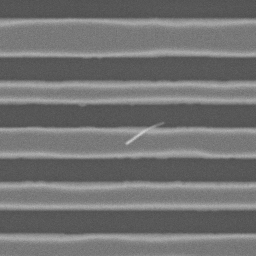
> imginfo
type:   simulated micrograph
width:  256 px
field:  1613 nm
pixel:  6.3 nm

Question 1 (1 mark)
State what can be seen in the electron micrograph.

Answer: lines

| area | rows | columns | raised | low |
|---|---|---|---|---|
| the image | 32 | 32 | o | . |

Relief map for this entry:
................................
................................
.ooooooooooooooo.oooo........ooo
oooooooooooooooooooooooooooooooo
oooooooooooooooooooooooooooooooo
oooooooooooooooooooooooooooooooo
oooooooooooooooooooooooooooooooo
................................
................................
................................
oooooooooooooooooooooooooooooooo
oooooooooooooooooooooooooooooooo
oooooooooooooooooooooooooooooooo
................................
................................
................................
oooooooooooooooooooooooooooooooo
oooooooooooooooooooooooooooooooo
oooooooooooooooooooooooooooooooo
oooooooooooooooooooooo..oooooooo
................................
................................
................................
oooooooooooooooooooooooooooooooo
oooooooooooooooooooooooooooooooo
oooooooooooooooooooooooooooooooo
................................
................................
................................
oooooooooooooooooooooooooooooooo
oooooooooooooooooooooooooooooooo
oooooooooooooooooooooooooooooooo